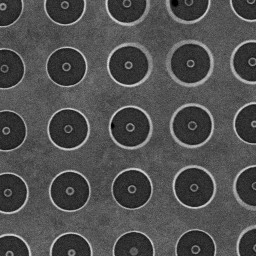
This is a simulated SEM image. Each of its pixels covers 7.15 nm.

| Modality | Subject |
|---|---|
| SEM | an array of small figures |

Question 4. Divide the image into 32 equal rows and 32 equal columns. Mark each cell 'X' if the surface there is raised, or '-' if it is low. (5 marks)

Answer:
---XXX-----XX-----XXX--X--XXX---
---XXX----XXXX----XXX-----XXX---
--XXXXX---XXXX---XXXXX---XXXXXX-
XXXXXXXXXXXXXXXXXXXXXXXXXXXXXXXX
XXXXXXXXXXXXXXXXXXXXXXXXXXXXXXXX
XXXXXXXXXXXXXXXXXXXXXXX--XXXXX--
--XXXXX---XXXX----XXXX----XXX---
---XXX-----XXX-----XX-----XXX--X
X--XXX--X--XXX-----XX-----XXX---
---XXX-----XXX----XXXX----XXXX--
--XXXXX--XXXXXX--XXXXXX--XXXXXXX
XXXXXXXXXXXXXXXXXXXXXXXXXXXXXXXX
XXXXXXXXXXXXXXXXXXXXXXXXXXXXXXXX
XXXXXXXXXXXXXXX--XXXXXX--XXXXX--
--XXXXX---XXXX----XXXX----XXXX--
---XXX-----XXX-----XX------XX---
---XXX-----XXX-----XXX----XXXX--
---XXX-----XXX----XXXX----XXXX--
--XXXXXX-XXXXXXXXXXXXXXXXXXXXXXX
XXXXXXXXXXXXXXXXXXXXXXXXXXXXXXXX
XXXXXXXXXXXXXXXXXXXXXXXXXXXXXXXX
XXXXXXXX-XXXXXX---XXXXX---XXXX--
---XXXX----XXX-----XXX-----XXX--
---XXX-----XXX--X--XXX--X--XX---
---XXX-----XXX-----XXX-----XXX--
---XXXX----XXXX---XXXXX---XXXX--
--XXXXXXXXXXXXXXXXXXXXXXXXXXXXXX
XXXXXXXXXXXXXXXXXXXXXXXXXXXXXXXX
XXXXXXXXXXXXXXXXXXXXXXXXXXXXXXXX
--XXXXXX--XXXXX---XXXXX---XXXX--
---XXXX----XXX-----XXX-----XXX--
----XX-----XXX-----XXX--X--XXX--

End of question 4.